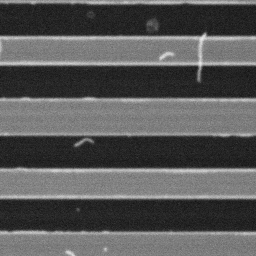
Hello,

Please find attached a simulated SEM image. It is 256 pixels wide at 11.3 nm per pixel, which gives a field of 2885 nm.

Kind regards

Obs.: lines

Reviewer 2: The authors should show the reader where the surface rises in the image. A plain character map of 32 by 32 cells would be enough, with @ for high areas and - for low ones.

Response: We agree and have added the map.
--------------------------------
--------------------------------
--------------------------------
--------------------------------
-------------------------@------
@@@@@@@@@@@@@@@@@@@@@@@@@@@@@@@@
@@@@@@@@@@@@@@@@@@@@@@@@@@@@@@@@
@@@@@@@@@@@@@@@@@@@@@@@@@@@@@@@@
--------------------------------
--------------------------------
--------------------------------
--------------------------------
@@@@@@@@@@@@@@@@@@@@@@@@@@@@@@@@
@@@@@@@@@@@@@@@@@@@@@@@@@@@@@@@@
@@@@@@@@@@@@@@@@@@@@@@@@@@@@@@@@
@@@@@@@@@@@@@@@@@@@@@@@@@@@@@@@@
@@@@@@@@@@@@@@@@@@@@@@@@@@@@@@@@
--------------------------------
--------------------------------
--------------------------------
--------------------------------
@@@@@@@@@@@@@@@@@@@@@@@@@@@@@@@@
@@@@@@@@@@@@@@@@@@@@@@@@@@@@@@@@
@@@@@@@@@@@@@@@@@@@@@@@@@@@@@@@@
@@@@@@@@@@@@@@@@@@@@@@@@@@@@@@@@
--------------------------------
--------------------------------
--------------------------------
--------------------------------
@@@@@@@@@@@@@@@@@@@@@@@@@@@@@@@@
@@@@@@@@@@@@@@@@@@@@@@@@@@@@@@@@
@@@@@@@@@@@@@@@@@@@@@@@@@@@@@@@@